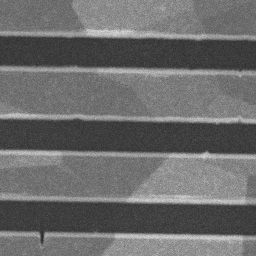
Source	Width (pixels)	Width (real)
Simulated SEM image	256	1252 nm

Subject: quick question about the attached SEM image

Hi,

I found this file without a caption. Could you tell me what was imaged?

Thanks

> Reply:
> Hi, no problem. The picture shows one or a few lines or trenches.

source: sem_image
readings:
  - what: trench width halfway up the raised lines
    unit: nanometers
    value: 173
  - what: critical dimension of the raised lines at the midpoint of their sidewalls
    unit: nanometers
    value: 226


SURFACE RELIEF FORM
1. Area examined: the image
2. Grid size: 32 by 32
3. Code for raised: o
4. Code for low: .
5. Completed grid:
oooooooooooooooooooooooooooooooo
oooooooooooooooooooooooooooooooo
oooooooooooooooooooooooooooooooo
oooooooooooooooooooooooooooooooo
.....................ooooooooooo
................................
................................
................................
................................
oooooooooooooooooooooooooooooooo
oooooooooooooooooooooooooooooooo
oooooooooooooooooooooooooooooooo
oooooooooooooooooooooooooooooooo
oooooooooooooooooooooooooooooooo
o..o.ooooooooooooooooooooooooooo
................................
................................
................................
................................
oooooooooooooooooooooooo.oo.....
oooooooooooooooooooooooooooooooo
oooooooooooooooooooooooooooooooo
oooooooooooooooooooooooooooooooo
oooooooooooooooooooooooooooooooo
oooooooooooooooooooooooooooooooo
................................
................................
................................
................................
ooooo.oooooooo..................
oooooooooooooooooooooooooooooooo
oooooooooooooooooooooooooooooooo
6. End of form